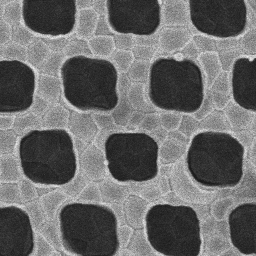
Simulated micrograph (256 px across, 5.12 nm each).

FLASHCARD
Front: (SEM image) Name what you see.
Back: holes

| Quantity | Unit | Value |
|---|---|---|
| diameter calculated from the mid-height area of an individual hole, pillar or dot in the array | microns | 0.291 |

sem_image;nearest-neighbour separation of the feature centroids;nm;429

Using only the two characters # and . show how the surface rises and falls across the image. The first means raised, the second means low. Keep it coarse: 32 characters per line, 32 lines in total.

###......####.......####.......#
###......#####......####.......#
###......#####......####.......#
####.....#####......#####.....##
###########################..###
################################
################################
########.....#######..########.#
....####......#####......####...
....####.......####......####...
....####.......####......####...
....####......#####......####...
....####.......####......####...
...#######....######.....#####..
################################
################################
####....########################
###......####......#####......##
##.......####.......####......##
###......####.......###.......##
###.......####......####......##
###......#####......####......##
####.....######.#..######.....##
################################
################################
#########.######################
...#####......#####.....#####...
....####......####.......####...
....####.......###.......####...
....####.......###.......####...
....####.......####......####...
....#####.....######.....#####..